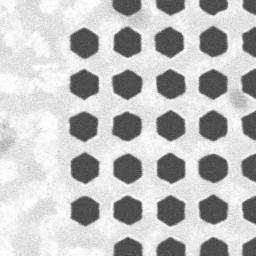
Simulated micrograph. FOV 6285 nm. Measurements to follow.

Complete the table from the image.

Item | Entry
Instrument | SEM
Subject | a regular array of holes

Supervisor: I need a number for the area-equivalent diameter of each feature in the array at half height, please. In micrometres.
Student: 0.744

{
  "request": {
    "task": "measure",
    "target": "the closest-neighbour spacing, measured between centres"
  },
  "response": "1.03 um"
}